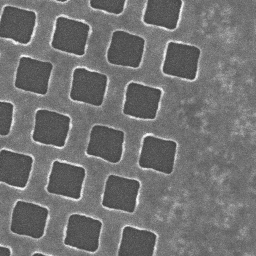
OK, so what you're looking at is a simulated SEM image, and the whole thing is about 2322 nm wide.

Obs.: a regular array of holes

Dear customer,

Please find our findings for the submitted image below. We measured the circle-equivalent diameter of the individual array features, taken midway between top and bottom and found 339 nm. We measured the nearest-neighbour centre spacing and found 491 nm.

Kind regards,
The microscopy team